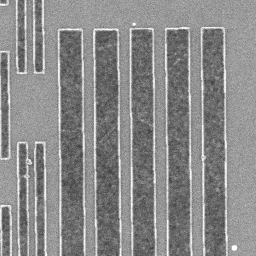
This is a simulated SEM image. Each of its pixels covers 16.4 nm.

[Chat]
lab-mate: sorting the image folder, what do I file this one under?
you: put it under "wiring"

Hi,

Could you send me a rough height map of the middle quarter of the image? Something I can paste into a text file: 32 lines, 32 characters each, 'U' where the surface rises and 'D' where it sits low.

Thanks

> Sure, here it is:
UUUUUDDDUUUUUDDDDUUUUUDDDDUUUUUD
UUUUUDDDUUUUUUDDDUUUUUDDDDUUUUUD
UUUUUDDDUUUUUUDDDUUUUUDDDDUUUUUD
UUUUUDDDUUUUUUDDDUUUUUDDDDUUUUUD
UUUUUDDDUUUUUUDDDUUUUUDDDDUUUUUD
UUUUUDDDUUUUUUDDDUUUUUDDDDUUUUUD
UUUUUDDDUUUUUUDDDUUUUUDDDDUUUUUD
UUUUUDDDUUUUUUDDDUUUUUDDDDUUUUUD
UUUUUDDDUUUUUUDDDUUUUUDDDDUUUUUD
UUUUUDDDUUUUUUDDDUUUUUDDDDUUUUUD
UUUUUDDDUUUUUUDDDUUUUUDDDDUUUUUD
UUUUUDDDUUUUUUDDDUUUUUDDDDUUUUUD
UUUUUDDDUUUUUUDDDUUUUUDDDDUUUUUD
UUUUUDDDUUUUUUDDDUUUUUDDDDUUUUUD
UUUUUDDDUUUUUUDDDUUUUUDDDDUUUUUD
UUUUUDDDUUUUUUDDDUUUUUDDDDUUUUUD
UUUUUDDDUUUUUUDDDUUUUUDDDDUUUUUD
UUUUUDDDUUUUUUDDDUUUUUDDDDUUUUUD
UUUUUDDDUUUUUUDDDUUUUUDDDDUUUUUD
UUUUUDDDUUUUUUDDDUUUUUDDDDUUUUUD
UUUUUDDDUUUUUUDDDUUUUUDDDDUUUUUD
UUUUUDDDUUUUUUDDDUUUUUDDDDUUUUUD
UUUUUDDDUUUUUUDDDUUUUUDDDDUUUUUD
UUUUUDDDUUUUUUDDDUUUUUDDDDUUUUUD
UUUUUDDDUUUUUUDDDUUUUUDDDDUUUUUD
UUUUUDDDUUUUUUDDDUUUUUDDDDUUUUUD
UUUUUDDDUUUUUUDDDUUUUUDDDDUUUUUU
UUUUUDDDUUUUUUDDDUUUUUUDDDUUUUUU
UUUUUDDDUUUUUUDDDUUUUUUDDDUUUUUU
UUUUUDDDUUUUUUDDDUUUUUUDDDUUUUUU
UUUUUDDDUUUUUUDDDUUUUUUDDDUUUUUU
UUUUUDDDUUUUUUDDDUUUUUUDDDUUUUUU